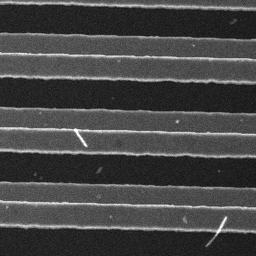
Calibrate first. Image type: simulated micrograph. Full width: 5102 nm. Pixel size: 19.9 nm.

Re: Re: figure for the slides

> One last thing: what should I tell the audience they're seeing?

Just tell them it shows lines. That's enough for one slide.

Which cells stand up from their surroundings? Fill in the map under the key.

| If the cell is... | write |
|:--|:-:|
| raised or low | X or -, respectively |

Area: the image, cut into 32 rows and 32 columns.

----XX--XXXXXXXXXXXXXXXXXXXXXXXX
--------------------------------
--------------------------------
--------------------------------
XXXXXXXXXXXXXXX-----------------
XXXXXXXXXXXXXXXXXXXXXXXXXXXXXXXX
XXXXXXXXXXXXXXXXXXXXXXXXXXXXXXXX
XXXXXXXXXXXXXXXXXXXXXXXXXXXXXXXX
XXXXXXXXXXXXXXXXXXXXXXXXXXXXXXXX
XXXXXXXXXXXXXXXXXXXXXXXXXXXXXXXX
--------------------------------
--------------------------------
--------------------------------
X-------------------------------
XXXXXXXXXXXXXXXXXXXXXXXXXXXXXXXX
XXXXXXXXXXXXXXXXXXXXXXXXXXXXXXXX
XXXXXXXXXXXXXXXXXXXXXXXXXXXXXXXX
XXXXXXXXXXXXXXXXXXXXXXXXXXXXXXXX
XXXXXXXXXXXXXXXXXXXXXXXXXXXXXXXX
-------------------------XXXXXXX
--------------------------------
--------------------------------
--------------------------------
XXXXXXXXXXXXXXXXXXXXXXXXXXXXX---
XXXXXXXXXXXXXXXXXXXXXXXXXXXXXXXX
XXXXXXXXXXXXXXXXXXXXXXXXXXXXXXXX
XXXXXXXXXXXXXXXXXXXXXXXXXXXXXXXX
XXXXXXXXXXXXXXXXXXXXXXXXXXXXXXXX
-------------X-XXXXXXXXXXXXXXXXX
--------------------------------
--------------------------------
--------------------------------